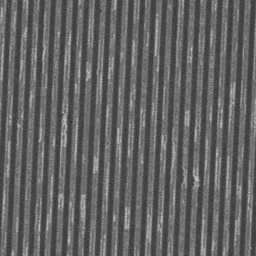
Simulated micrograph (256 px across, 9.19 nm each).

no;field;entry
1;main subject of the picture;parallel lines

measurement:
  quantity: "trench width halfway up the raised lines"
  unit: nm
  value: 49.3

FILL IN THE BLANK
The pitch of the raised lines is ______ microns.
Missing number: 0.102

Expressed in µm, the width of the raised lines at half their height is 0.0493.